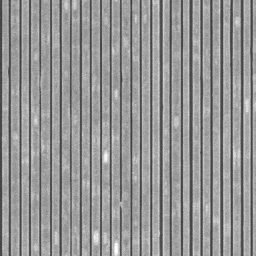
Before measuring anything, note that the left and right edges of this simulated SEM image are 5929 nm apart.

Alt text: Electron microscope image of parallel lines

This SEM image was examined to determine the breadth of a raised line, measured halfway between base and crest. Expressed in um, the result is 0.177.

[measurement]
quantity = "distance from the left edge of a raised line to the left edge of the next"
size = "233 nm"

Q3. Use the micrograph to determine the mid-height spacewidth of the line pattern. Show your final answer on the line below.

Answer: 0.0637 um